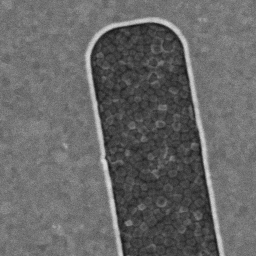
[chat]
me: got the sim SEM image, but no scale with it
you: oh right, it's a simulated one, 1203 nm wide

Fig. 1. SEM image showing one or a few lines or trenches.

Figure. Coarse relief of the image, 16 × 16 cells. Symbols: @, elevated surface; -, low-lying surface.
@@@@@@@@@@@@@@@@
@@@@@@@@--@@@@@@
@@@@@@-----@@@@@
@@@@@@------@@@@
@@@@@@------@@@@
@@@@@@------@@@@
@@@@@@------@@@@
@@@@@@------@@@@
@@@@@@-------@@@
@@@@@@-------@@@
@@@@@@@------@@@
@@@@@@@------@@@
@@@@@@@------@@@
@@@@@@@------@@@
@@@@@@@-------@@
@@@@@@@-------@@